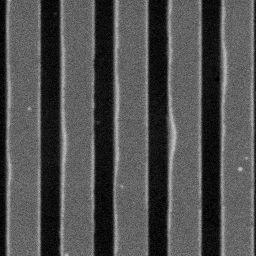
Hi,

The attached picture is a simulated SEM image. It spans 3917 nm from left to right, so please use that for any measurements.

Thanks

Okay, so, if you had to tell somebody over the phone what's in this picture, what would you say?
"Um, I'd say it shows lines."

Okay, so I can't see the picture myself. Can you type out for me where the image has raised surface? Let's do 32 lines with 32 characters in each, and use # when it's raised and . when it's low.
.####...####..####...####...####
.####...####..####...####...####
.####...####..####...####...####
.####...####..####...####...####
.####...####..####...####...####
.####...####..####...####...####
.####...####..####...####...####
.####...####..####...####...####
.####...####..####...####...####
.####...####..####...####...####
.####...####..####...####...####
.####...####..####...####...####
.####...####..####...####...####
.####...####..####...####...####
.####...####..####...####...####
.####...####..####...####...####
.####...####..####...####...####
.####...####..####...####...####
.####...####..####...####...####
.####...####..####...####...####
.####...####..####...####...####
.####...####..####...####...####
.####...####..####...####...####
.####...####..####...####...####
.####...####..####...####...####
.####...####..####...####...####
.####...####..####...####...####
.####...####..####...####...####
.####...####..####...####...####
.####...####..####...####...####
.####...####..####...####...####
.####...####..####...####...####